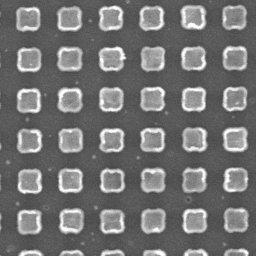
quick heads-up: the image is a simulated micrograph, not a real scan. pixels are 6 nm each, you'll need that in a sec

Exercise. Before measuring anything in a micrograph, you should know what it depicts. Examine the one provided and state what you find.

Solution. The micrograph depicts a regular array of raised bodies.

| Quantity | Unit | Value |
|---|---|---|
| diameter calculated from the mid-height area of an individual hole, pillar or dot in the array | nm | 152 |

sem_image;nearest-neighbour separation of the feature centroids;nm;242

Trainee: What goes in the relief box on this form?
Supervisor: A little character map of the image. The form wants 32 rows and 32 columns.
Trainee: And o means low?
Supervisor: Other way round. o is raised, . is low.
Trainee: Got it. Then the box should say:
................................
..ooo..ooo..ooo...oo...ooo..ooo.
..ooo..ooo..ooo...oo...ooo..ooo.
..ooo..ooo...oo...oo....o...oo..
................................
................................
..ooo..ooo...oo...ooo..ooo..ooo.
..ooo..ooo...oo...ooo..ooo..ooo.
..ooo...oo...oo...oo...oo...oo..
................................
................................
..ooo..ooo...oo...oo...ooo..ooo.
..ooo..ooo...oo...oo...ooo..ooo.
..ooo..ooo...oo...oo...oo...ooo.
................................
................................
...oo...oo...oo...oo...ooo..ooo.
..ooo...oo...oo...oo...ooo..ooo.
..ooo...oo...oo...oo...ooo..ooo.
................................
................................
...oo...oo...oo...oo...ooo..ooo.
..ooo..ooo...oo...ooo..ooo..ooo.
..ooo..ooo...oo...oo...ooo..ooo.
................................
................................
...oo...oo...oo...oo...ooo..ooo.
..ooo..ooo...oo...ooo..ooo..ooo.
..ooo...oo...oo...oo...ooo..ooo.
................................
................................
...oo...oo...oo...oo...ooo..ooo.